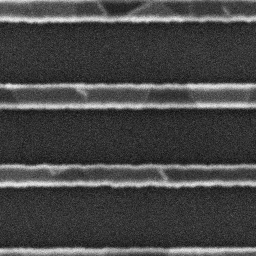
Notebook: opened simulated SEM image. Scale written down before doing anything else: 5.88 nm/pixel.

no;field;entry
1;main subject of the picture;lines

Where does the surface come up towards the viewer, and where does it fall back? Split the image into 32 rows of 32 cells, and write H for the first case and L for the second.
HHHHHHHHHHHHHHHHHHHHHHHHHHHHHHHH
HHHHHHHHHHHHHHHHHHHHHHHHHHHHHHHH
HHHHHHHHHHHHHHHHHHHHHHHHHHHHHHHH
LLLLLLLLLLLLLLLLLLLLLLLLLLLLLLLL
LLLLLLLLLLLLLLLLLLLLLLLLLLLLLLLL
LLLLLLLLLLLLLLLLLLLLLLLLLLLLLLLL
LLLLLLLLLLLLLLLLLLLLLLLLLLLLLLLL
LLLLLLLLLLLLLLLLLLLLLLLLLLLLLLLL
LLLLLLLLLLLLLLLLLLLLLLLLLLLLLLLL
LLLLLLLLLLLLLLLLLLLLLLLLLLLLLLLL
LLLLLLLLLLLLLLLLLLLLLLLLLLLLLLLL
HHHHHHHHHHHHHHHHHHHHHHHHHHHHHHHH
HHHHHHHHHHHHHHHHHHHHHHHHHHHHHHHH
LHHHLLHHLHHLLLLLLHLLLLLLLLLLLLLL
LLLLLLLLLLLLLLLLLLLLLLLLLLLLLLLL
LLLLLLLLLLLLLLLLLLLLLLLLLLLLLLLL
LLLLLLLLLLLLLLLLLLLLLLLLLLLLLLLL
LLLLLLLLLLLLLLLLLLLLLLLLLLLLLLLL
LLLLLLLLLLLLLLLLLLLLLLLLLLLLLLLL
LLLLLLLLLLLLLLLLLLLLLLLLLLLLLLLL
LLLLLLLLLLLLLLLLLLLLLLLLLLLLLLLL
HHHHHHHHHHHHHHHHHHHHHHHHHHHHHHHH
HHHHHHHHHHHHHHHHHHHHHHHHHHHHHHHH
LLLLLLLLLLLLLLLLLLLLLLLLLLLLLLLL
LLLLLLLLLLLLLLLLLLLLLLLLLLLLLLLL
LLLLLLLLLLLLLLLLLLLLLLLLLLLLLLLL
LLLLLLLLLLLLLLLLLLLLLLLLLLLLLLLL
LLLLLLLLLLLLLLLLLLLLLLLLLLLLLLLL
LLLLLLLLLLLLLLLLLLLLLLLLLLLLLLLL
LLLLLLLLLLLLLLLLLLLLLLLLLLLLLLLL
LLLLLLLLLLLLLLLLLLLLLLLLLLLLLLLL
HHHHHHHHHHHHHHHHHHHHHHHHHHHHHHHH